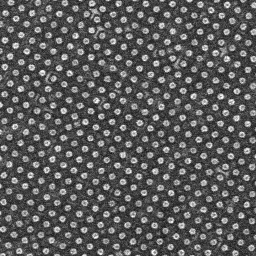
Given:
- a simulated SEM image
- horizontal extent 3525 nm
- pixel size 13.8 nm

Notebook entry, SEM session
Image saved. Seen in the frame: a regular array of raised bodies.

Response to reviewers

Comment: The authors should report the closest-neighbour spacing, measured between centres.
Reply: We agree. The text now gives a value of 162 nanometres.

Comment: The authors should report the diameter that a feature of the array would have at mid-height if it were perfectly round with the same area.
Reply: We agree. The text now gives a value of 80.7 nanometers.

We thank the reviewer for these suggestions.